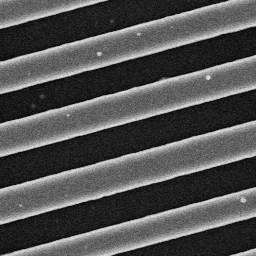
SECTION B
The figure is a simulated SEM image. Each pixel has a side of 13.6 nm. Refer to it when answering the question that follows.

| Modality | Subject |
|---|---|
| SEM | lines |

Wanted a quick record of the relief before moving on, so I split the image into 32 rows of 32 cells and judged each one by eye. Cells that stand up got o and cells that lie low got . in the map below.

oooooooooooo...............ooooo
oooooooo...............ooooooooo
oooo................oooooooooooo
................ooooooooooooooo.
............ooooooooooooooo.....
........ooooooooooooooo.........
.....ooooooooooooooo............
.ooooooooooooooo..............oo
oooooooooooo..............oooooo
ooooooooo.............oooooooooo
ooooo..............ooooooooooooo
o..............ooooooooooooooo..
...........oooooooooooooooo.....
........ooooooooooooooo.........
....ooooooooooooooo.............
oooooooooooooooo..............oo
oooooooooooo..............oooooo
oooooooo...............ooooooooo
oooo...............ooooooooooooo
o..............ooooooooooooooooo
............oooooooooooooooo....
........ooooooooooooooooo.......
....ooooooooooooooooo...........
ooooooooooooooooo...............
ooooooooooooo...............oooo
oooooooooo..............oooooooo
oooooo..............oooooooooooo
oo...............ooooooooooooo..
.............oooooooooooooo.....
.........oooooooooooooo.........
......ooooooooooooo.............
..ooooooooooooo...............oo